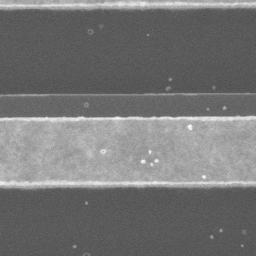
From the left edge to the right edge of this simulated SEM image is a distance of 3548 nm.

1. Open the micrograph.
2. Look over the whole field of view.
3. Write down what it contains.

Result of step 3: lines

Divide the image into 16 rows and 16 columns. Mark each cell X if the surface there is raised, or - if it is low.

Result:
----------------
----------------
----------------
----------------
----------------
----------------
XXXXXXXXXXXXXXXX
XXXXXXXXXXXXXXXX
XXXXXXXXXXXXXXXX
XXXXXXXXXXXXXXXX
XXXXXXXXXXXXXXXX
XXXXXXXXXXXX----
----------------
----------------
----------------
----------------